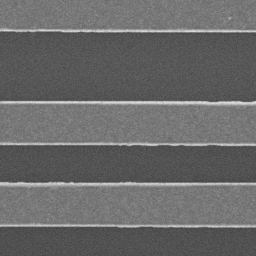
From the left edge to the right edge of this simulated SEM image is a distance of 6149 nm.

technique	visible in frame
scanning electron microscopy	lines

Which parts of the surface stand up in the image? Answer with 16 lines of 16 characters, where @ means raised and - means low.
@@@@@@@@@@@@@@@@
@@@@@@@@@@@@@@@@
----------------
----------------
----------------
----------------
@@@@@@@@@@@@@@@@
@@@@@@@@@@@@@@@@
@@@@@@@@@@@@@@@@
----------------
----------------
@@@@@@@@@@@@@@@@
@@@@@@@@@@@@@@@@
@@@@@@@@@@@@@@@@
----------------
----------------